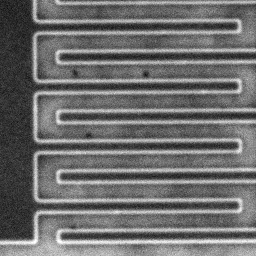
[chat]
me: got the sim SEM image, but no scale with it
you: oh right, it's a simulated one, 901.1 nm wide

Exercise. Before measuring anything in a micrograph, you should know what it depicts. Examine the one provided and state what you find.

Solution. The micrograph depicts groups of lines, slits or small figures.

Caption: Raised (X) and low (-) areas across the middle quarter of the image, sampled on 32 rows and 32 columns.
--------------------------------
--------------------------------
--------------------------------
--------------------------------
XXXXXXXXXXXXXXXXXXXXXXXXXXXXXXXX
XXXXXXXXXXXXXXXXXXXXXXXXXXXXXXXX
XXXXXXXXXXXXXXXXXXXXXXXXXXXXXXXX
--------------------------------
--------------------------------
--------------------------------
--------------------------------
--------------------------------
XXXXXXXXXXXXXXXXXXXXXXXXXXXXXXXX
XXXXXXXXXXXXXXXXXXXXXXXXXXXXXXXX
XXXXXXXXXXXXXXXXXXXXXXXXXXXXXXXX
--------------------------------
--------------------------------
--------------------------------
--------------------------------
XXXXXXXXXXXXXXXXXXXXXXXXXXXXXXXX
XXXXXXXXXXXXXXXXXXXXXXXXXXXXXXXX
XXXXXXXXXXXXXXXXXXXXXXXXXXXXXXXX
--------------------------------
--------------------------------
--------------------------------
--------------------------------
--------------------------------
XXXXXXXXXXXXXXXXXXXXXXXXXXXXXXXX
XXXXXXXXXXXXXXXXXXXXXXXXXXXXXXXX
XXXXXXXXXXXXXXXXXXXXXXXXXXXXXXXX
--------------------------------
--------------------------------